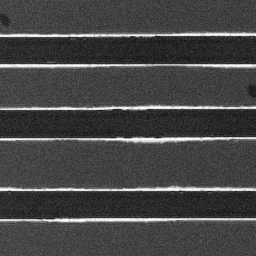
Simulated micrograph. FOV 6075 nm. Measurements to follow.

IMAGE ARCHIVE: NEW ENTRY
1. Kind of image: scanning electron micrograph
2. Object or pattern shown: lines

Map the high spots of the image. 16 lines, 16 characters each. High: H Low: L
HHHHHHHHHHHHHHHH
HHHHHHHHHHHHHHHH
LLLLLLLLLLLLLLLL
LLLLLLLLLLLLLLLL
HHHHHHHHHHHHHHHH
HHHHHHHHHHHHHHHH
HHHHHHHHHHHHHHHH
LLLLLLLLLLLLLLLL
LLLLLLLLLLLLLLLL
HHHHHHHHHHHHHHHH
HHHHHHHHHHHHHHHH
HHHHHHHHHHHHHHHH
LLLLLLLLLLLLLLLL
LLLLLLLLLLLLLLLL
HHHHHHHHHHHHHHHH
HHHHHHHHHHHHHHHH